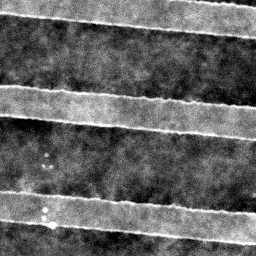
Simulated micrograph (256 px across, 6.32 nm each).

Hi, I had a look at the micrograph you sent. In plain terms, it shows lines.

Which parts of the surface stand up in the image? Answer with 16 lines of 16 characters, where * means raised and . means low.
****************
......**********
................
................
................
**..............
*************...
...*************
.............***
................
................
................
******..........
****************
........********
................